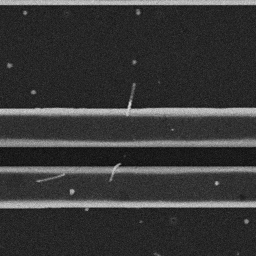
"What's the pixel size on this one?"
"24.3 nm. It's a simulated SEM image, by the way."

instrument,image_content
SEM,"lines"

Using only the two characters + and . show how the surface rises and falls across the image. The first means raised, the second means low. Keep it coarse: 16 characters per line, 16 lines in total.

................
................
................
................
................
................
................
++++++++++++++++
++++++++++++++++
................
.......+......++
++++++++++++++++
++++++++++++++++
................
................
................